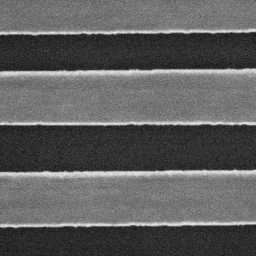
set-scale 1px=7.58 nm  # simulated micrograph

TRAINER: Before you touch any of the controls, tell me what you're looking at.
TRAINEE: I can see lines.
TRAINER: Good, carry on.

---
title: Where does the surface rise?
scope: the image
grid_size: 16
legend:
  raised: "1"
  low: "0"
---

1111111111111111
1111111111111111
0000000000000000
0000000000000000
0111111111111111
1111111111111111
1111111111111111
1111111111111111
0000000000000000
0000000000000000
0000000000000000
1111111111111111
1111111111111111
1111111111111111
0000000000000000
0000000000000000